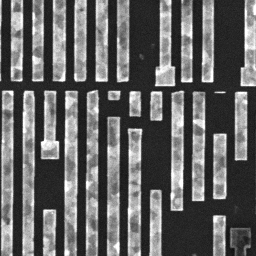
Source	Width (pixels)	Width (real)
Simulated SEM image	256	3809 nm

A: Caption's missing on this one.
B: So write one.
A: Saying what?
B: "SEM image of wiring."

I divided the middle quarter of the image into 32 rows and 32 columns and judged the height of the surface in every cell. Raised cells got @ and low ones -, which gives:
---@@---@@@--@@@--------@@@---@@
---@@---@@@--@@@-------@@@@@--@@
---@@---@@@--@@@-------@@@@@--@@
---@@---@@@--@@@-------@@@@@--@@
-----------------------@@@@@----
--------------------------------
--------------------------------
-@@---@@---@@@---@@---@@---@@@--
-@@---@@---@@@---@@---@@---@@@--
-@@---@@---------@@---@@---@@@--
-@@---@@---------@@---@@---@@@--
-@@---@@---------@@---@@---@@@--
-@@---@@---------@@---@@---@@@--
-@@---@@---@@@--------@@---@@@--
-@@---@@---@@@-------------@@@--
-@@---@@---@@@-------------@@@--
-@@---@@---@@@--@@@--------@@@--
-@@---@@---@@@--@@@--------@@@--
-@@---@@---@@@--@@@--------@@@--
-@@---@@---@@@--@@@--------@@@--
@@@---@@---@@@--@@@--------@@@--
@@@---@@---@@@--@@@--------@@@--
@@@---@@---@@@--@@@--------@@@--
@@@---@@---@@@--@@@--------@@@--
@@@---@@---@@@--@@@--------@@@--
@@@---@@---@@@--@@@--------@@@--
@@@---@@---@@@--@@@--------@@@--
@@@---@@---@@@--@@@--------@@@--
@@@---@@---@@@--@@@--------@@@--
@@@---@@---@@@--@@@--------@@@--
@@@---@@---@@@--@@@--------@@@--
@@@---@@---@@@--@@@--------@@@--